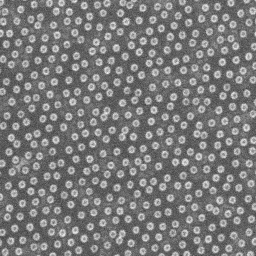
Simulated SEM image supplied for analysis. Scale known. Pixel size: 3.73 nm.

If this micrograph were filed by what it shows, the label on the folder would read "a regular array of raised bodies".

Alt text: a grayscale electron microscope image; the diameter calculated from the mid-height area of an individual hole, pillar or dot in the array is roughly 5.84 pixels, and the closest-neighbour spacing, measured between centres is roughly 41.6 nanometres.